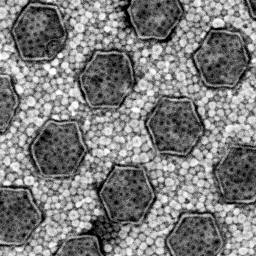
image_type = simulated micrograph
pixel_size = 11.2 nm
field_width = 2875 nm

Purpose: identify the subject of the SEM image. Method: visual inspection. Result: raised bodies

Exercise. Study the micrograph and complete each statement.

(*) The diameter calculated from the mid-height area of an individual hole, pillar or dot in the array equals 599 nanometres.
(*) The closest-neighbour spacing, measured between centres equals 924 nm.